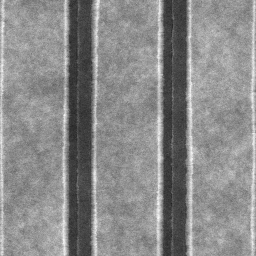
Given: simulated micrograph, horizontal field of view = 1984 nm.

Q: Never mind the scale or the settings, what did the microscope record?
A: lines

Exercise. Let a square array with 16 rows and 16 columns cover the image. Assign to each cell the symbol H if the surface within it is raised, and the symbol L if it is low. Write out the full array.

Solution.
HHHHLLHHHHLLHHHH
HHHHLLHHHHLLHHHH
HHHHLLHHHHLLHHHH
HHHHLLHHHHLLHHHH
HHHHLLHHHHLLHHHH
HHHHLLHHHHLLHHHH
HHHHLLHHHHLLHHHH
HHHHLLHHHHLLHHHH
HHHHLLHHHHLLHHHH
HHHHLLHHHHLLHHHH
HHHHLLHHHHLLHHHH
HHHHLLHHHHLLHHHH
HHHHLLHHHHLLHHHH
HHHHLLHHHHLLHHHH
HHHHLLHHHHLLHHHH
HHHHLLHHHHLLHHHH